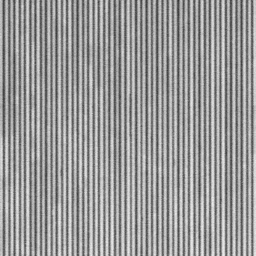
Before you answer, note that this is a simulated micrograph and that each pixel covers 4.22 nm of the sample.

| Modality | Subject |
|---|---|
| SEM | parallel lines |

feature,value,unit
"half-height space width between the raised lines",0.0084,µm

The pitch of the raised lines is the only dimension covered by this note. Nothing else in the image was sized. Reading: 22.3 nm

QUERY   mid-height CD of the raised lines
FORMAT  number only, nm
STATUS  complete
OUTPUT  12.1